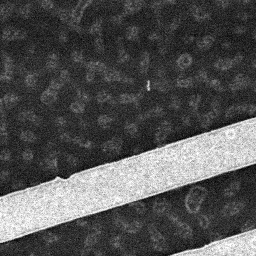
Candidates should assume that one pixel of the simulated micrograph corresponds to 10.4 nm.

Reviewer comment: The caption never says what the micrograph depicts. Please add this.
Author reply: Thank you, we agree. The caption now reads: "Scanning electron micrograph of one or a few lines or trenches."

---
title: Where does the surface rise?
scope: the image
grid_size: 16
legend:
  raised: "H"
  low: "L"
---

LLLLLLLLLLLLLLLL
LLLLLLLLLLLLLLLL
LLLLLLLLLLLLLLLL
LLLLLLLLLLLLLLLL
LLLLLLLLLLLLLLLL
LLLLLLLLLLLLLLLL
LLLLLLLLLLLLLLLL
LLLLLLLLLLLLLLLH
LLLLLLLLLLLLHHHH
LLLLLLLLLHHHHHHH
LLLLLLHHHHHHHHHL
LLLHHHHHHHHHLLLL
HHHHHHHHLLLLLLLL
HHHHHLLLLLLLLLLL
HHLLLLLLLLLLLLLH
LLLLLLLLLLLLLHHH